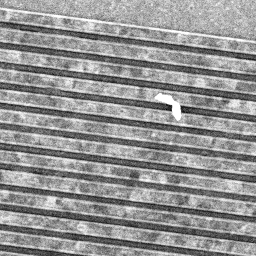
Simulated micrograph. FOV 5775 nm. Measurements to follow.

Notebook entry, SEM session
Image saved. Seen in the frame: parallel lines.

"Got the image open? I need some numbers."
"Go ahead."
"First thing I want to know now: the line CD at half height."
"271 nanometres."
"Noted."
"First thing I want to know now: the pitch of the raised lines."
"20.1 px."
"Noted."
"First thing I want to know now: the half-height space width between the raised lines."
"187 nm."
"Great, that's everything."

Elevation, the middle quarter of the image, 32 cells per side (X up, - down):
XXXXXXXXXXXXXXX-----------------
--XXXXXXXXXXXXXXXXXXXX----------
----------XXXXXXXXXXXXXXXXXXXX--
------------------XXXXXXXXXXXXXX
XXXXXXXX-----------------XXXXXXX
XXXXXXXXXXXXXXXX----------------
-XXXXXXXXXXXXXXXXXXXXXX---------
---------XXXXXXXXXXXXXXXXXXXXXX-
-----------------XXXXXXXXXXXXXXX
XXXXXXX-----------------XXXXXXXX
XXXXXXXXXXXXXXX------------XX---
XXXXXXXXXXXXXXXXXXXXXX-----XX---
--------XXXXXXXXXXXXXXXXXXXXXX--
----------------XXXXXXXXXXXXXXXX
XXXXXXXX---------------XXXXXXXXX
XXXXXXXXXXXXXX-----------------X
-XXXXXXXXXXXXXXXXXXXX-----------
---------XXXXXXXXXXXXXXXXXXXXXX-
----------------XXXXXXXXXXXXXXXX
XXXXXXX-----------------XXXXXXXX
XXXXXXXXXXXXXXX-----------------
XXXXXXXXXXXXXXXXXXXXXX----------
--------XXXXXXXXXXXXXXXXXXXXXX--
---------------XXXXXXXXXXXXXXXXX
XXXXXX-----------------XXXXXXXXX
XXXXXXXXXXXXXX-----------------X
-XXXXXXXXXXXXXXXXXXXX-----------
---------XXXXXXXXXXXXXXXXXXXX---
----------------XXXXXXXXXXXXXXXX
XXXXXXX-----------------XXXXXXXX
XXXXXXXXXXXXXX------------------
XXXXXXXXXXXXXXXXXXXXX-----------